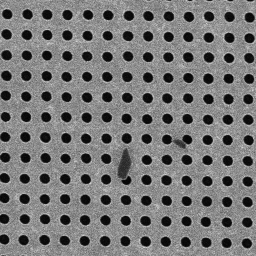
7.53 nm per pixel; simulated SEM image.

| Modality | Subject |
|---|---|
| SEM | a regular array of holes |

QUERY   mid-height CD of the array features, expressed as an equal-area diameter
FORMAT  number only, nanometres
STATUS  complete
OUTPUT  75.5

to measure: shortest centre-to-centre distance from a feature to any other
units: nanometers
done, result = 150